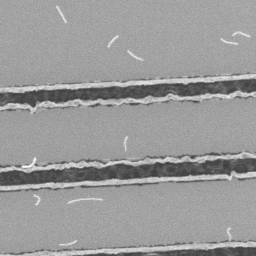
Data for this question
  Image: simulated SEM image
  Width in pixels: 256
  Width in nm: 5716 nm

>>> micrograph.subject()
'one or a few lines or trenches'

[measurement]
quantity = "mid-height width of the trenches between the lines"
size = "1410 nm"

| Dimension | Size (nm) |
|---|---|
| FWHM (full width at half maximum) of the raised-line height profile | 428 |